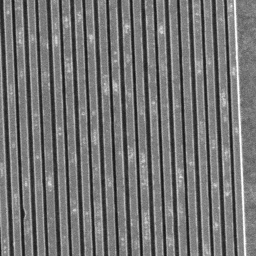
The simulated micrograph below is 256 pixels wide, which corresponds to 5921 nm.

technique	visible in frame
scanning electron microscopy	parallel lines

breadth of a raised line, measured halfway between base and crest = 168 nanometres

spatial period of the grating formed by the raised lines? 11.8 pixels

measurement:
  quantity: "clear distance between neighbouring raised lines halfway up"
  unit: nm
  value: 93.9